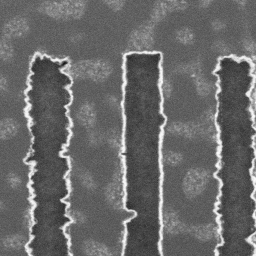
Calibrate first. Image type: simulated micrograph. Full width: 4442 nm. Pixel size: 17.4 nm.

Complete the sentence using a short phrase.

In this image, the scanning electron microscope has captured one or a few lines or trenches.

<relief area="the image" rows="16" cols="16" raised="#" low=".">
################
################
################
########..######
##..####..####..
##..####..####..
##..####..####..
##..####..####..
##..####..####..
##..####..####..
##..####..####..
##..####..####..
##..####..####..
##..####..####..
##..####..####..
##..####..####..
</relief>